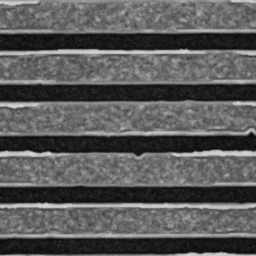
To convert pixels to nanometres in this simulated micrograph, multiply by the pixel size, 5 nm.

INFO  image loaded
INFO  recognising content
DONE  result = parallel lines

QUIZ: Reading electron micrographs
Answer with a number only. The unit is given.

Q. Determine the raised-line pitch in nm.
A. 256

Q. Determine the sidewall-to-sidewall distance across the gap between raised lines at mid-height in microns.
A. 0.0887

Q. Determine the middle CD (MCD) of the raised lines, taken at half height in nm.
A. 168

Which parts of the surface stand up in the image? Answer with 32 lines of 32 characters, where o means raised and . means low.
oooooooooooooooooooooooooooooooo
oooooooooooooooooooooooooooooooo
oooooooooooooooooooooooooooooooo
oooooooooooooooooooooooooooooooo
................................
................................
oooooooooooooooooooooooooooooooo
oooooooooooooooooooooooooooooooo
oooooooooooooooooooooooooooooooo
oooooooooooooooooooooooooooooooo
................................
................................
................................
oooooooooooooooooooooooooooooooo
oooooooooooooooooooooooooooooooo
oooooooooooooooooooooooooooooooo
oooooooooooooooooooooooooooooooo
................................
................................
oooooooooooooooooooooooooooooooo
oooooooooooooooooooooooooooooooo
oooooooooooooooooooooooooooooooo
oooooooooooooooooooooooooooooooo
................................
................................
....oo.........ooo..o...........
oooooooooooooooooooooooooooooooo
oooooooooooooooooooooooooooooooo
oooooooooooooooooooooooooooooooo
oooooooooooooooooooooooooooooooo
................................
................................